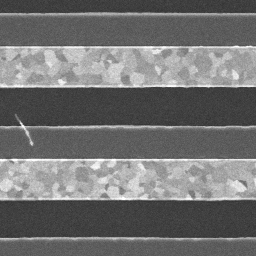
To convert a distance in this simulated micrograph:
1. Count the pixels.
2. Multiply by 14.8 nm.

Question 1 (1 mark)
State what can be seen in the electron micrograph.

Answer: lines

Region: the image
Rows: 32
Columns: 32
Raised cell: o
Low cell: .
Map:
................................
................................
oooooooooooooooooooooooooooooooo
oooooooooooooooooooooooooooooooo
oooooooooooooooooooooooooooooooo
oooooooooooooooooooooooooooooooo
oooooooooooooooooooooooooooooooo
oooooooooooooooooooooooooooooooo
oooooooooooooooooooooooooooooooo
oooooooooooooooooooooooooooooooo
oooooooooooooooooooooooooooooooo
................................
................................
................................
................................
................................
oooooooooooooooooooooooooooooooo
oooooooooooooooooooooooooooooooo
oooooooooooooooooooooooooooooooo
oooooooooooooooooooooooooooooooo
oooooooooooooooooooooooooooooooo
oooooooooooooooooooooooooooooooo
oooooooooooooooooooooooooooooooo
oooooooooooooooooooooooooooooooo
oooooooooooooooooooooooooooooooo
................................
................................
................................
................................
................................
oooooooooooooooooooooooooooooooo
oooooooooooooooooooooooooooooooo